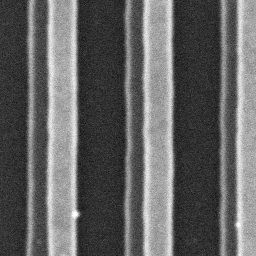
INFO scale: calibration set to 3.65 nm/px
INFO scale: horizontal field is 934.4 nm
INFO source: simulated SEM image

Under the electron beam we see lines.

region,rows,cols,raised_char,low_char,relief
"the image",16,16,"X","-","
--XXX---XXX---XX
--XXX---XXX---XX
--XXX---XXX---XX
--XXX---XXX---XX
--XXX---XXX---XX
--XXX---XXX---XX
--XXX---XXX---XX
--XXX---XXX---XX
--XXX---XXX---XX
--XXX---XXX---XX
--XXX---XXX---XX
--XXX---XXX---XX
--XXX---XXX---XX
--XXX---XXX---XX
--XXX---XXX---XX
--XXX---XXX---XX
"